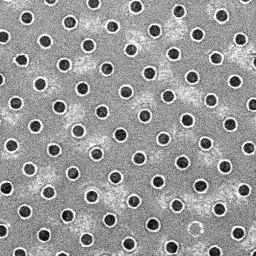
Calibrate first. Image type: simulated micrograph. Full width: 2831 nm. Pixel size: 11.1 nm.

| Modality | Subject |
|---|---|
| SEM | a regular array of raised bodies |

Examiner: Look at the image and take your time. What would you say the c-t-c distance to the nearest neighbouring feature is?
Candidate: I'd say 331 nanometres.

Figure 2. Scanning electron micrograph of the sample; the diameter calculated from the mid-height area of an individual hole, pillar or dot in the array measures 145 nanometers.